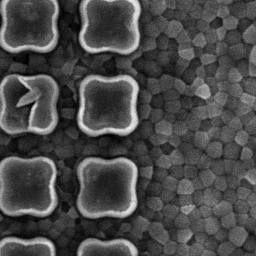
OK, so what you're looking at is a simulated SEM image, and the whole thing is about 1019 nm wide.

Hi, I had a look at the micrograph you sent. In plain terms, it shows raised bodies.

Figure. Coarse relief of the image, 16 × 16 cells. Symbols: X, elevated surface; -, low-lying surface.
XXXX-XXXX-------
XXX--XXXX-------
XXX--XXXX-------
----------------
----------------
XXXX-XXXX-------
XXX--XXX--------
XXX--XXX--------
----------------
----------------
XXX--XXX--------
XXX--XXX--------
XXX--XXX--------
----------------
----------------
XXX--XXX--------